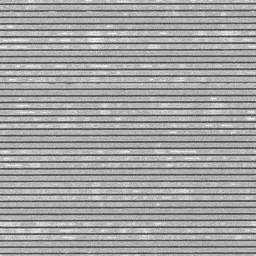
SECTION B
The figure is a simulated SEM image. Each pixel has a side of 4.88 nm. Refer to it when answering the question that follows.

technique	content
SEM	parallel lines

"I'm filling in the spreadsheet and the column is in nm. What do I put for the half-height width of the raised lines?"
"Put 23.2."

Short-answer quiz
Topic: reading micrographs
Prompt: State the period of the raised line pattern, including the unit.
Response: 32 nanometers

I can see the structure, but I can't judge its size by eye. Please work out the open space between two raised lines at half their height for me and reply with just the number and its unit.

9.2 nm